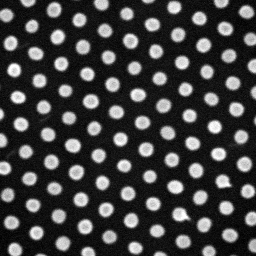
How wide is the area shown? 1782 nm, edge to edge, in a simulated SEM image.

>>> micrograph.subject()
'a regular array of raised bodies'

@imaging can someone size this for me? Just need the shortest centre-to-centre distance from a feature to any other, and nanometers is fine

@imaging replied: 187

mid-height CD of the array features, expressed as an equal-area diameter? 86.8 nm